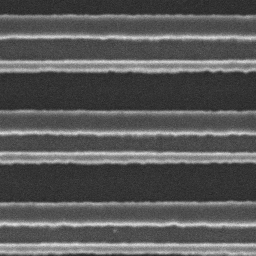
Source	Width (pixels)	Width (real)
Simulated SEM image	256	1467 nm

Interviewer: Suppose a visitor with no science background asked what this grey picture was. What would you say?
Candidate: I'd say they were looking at lines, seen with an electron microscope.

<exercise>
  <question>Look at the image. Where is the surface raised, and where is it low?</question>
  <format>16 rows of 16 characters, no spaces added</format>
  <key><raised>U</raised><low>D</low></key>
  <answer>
DDDDDDDDDDDDDDDD
UUUUUUUUUUUUUUUU
UUUUUUUUUUUUUUUU
UUUUUUUUUUUUUUUU
DDDDDDDDDDDDDDDD
DDDDDDDDDDDDDDDD
DDDDDDDDDDDDDDDD
UUUUUUUUUUUUUUUU
UUUUUUUUUUUUUUUU
UUUUUUUUUUUUUUUU
DDDDDDDDDDDDDDDD
DDDDDDDDDDDDDDDD
DDDDDDDDDDDDDDDD
UUUUUUUUUUUUUUUU
UUUUUUUUUUUUUUUU
UUUUUUUUUUUUUUUU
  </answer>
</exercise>